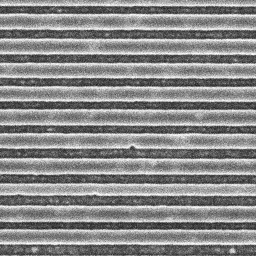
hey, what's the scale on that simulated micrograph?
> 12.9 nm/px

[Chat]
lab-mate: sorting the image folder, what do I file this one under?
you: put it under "parallel lines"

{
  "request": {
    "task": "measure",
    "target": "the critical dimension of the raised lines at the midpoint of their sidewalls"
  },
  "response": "190 nm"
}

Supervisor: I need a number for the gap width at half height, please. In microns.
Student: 0.119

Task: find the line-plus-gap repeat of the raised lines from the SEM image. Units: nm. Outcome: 309